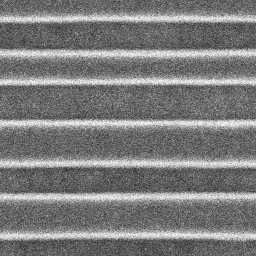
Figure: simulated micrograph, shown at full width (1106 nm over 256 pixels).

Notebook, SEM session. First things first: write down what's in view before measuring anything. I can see one or a few lines or trenches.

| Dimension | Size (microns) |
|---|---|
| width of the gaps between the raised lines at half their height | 0.138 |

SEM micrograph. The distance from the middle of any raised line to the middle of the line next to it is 321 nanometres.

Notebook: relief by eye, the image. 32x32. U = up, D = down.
UUUUUUUUUUUUUUUUUUUUUUUUUUUUUUUU
UUUUUUUUUUUUUUUUUUUUUUUUUUUUUUUU
UUUUUUUDDDDDDDDDDDDDDDDDDDDUDDDU
DDDDDDDDDDDDDDDDDDDDDDDDDDDDDDDD
DDDDDDDDDDDDDDDDDDDDDDDDDDDDDDDD
DDDDDDDDDDDDDDDDDDDDDDDDDDDDDDDD
DUDDDDDDDDDDDDDDDDDDDDDDDDDDDDDD
UUUUUUUUUUUUUUUUUUUUUUUUUUUUUUUU
UUUUUUUUUUUUUUUUUUUUUUUUUUUUUUUU
UUUUUUUUUUUUUUUUUUUUUUUUUUUUUUUU
DDDDDDDDDDDDDDDDDDDDDDDDDDDDDDDD
DDDDDDDDDDDDDDDDDDDDDDDDDDDDDDDD
DDDDDDDDDDDDDDDDDDDDDDDDDDDDDDDD
DDDDDDDDDDDDDDDDDDDDDDDDDDDDDDDD
DDDDDDDDDDDDDDDDDDDDDDDDDDDDDDDD
UUUUUUUUUUUUUUUUUUUUUUUUUUUUUUUU
UUUUUUUUUUUUUUUUUUUUUUUUUUUUUUUU
UUUUUUUUUUUUUUUUUUUUUUUUUUUUUUUU
UUUUUUUUUUUUUUUUUUUUUUUUUUUUUUUU
UUUUUUUUUUUUUUUUUUUUUUUUUUUUUUUU
UUUUUUUUUUUUUUUUUUUUUUUUUUUUUUUU
DDDDDDDDDDDDDDDDDDDDDDDDDDDDDDDD
DDDDDDDDDDDDDDDDDDDDDDDDDDDDDDDD
DDDDDDDDDDDDDDDDDDDDDDDDDDDDDDDD
DDDDDDDUUUUUUUUUUUUUUUUUUUUUUUUU
UUUUUUUUUUUUUUUUUUUUUUUUUUUUUUUU
UUUUUUUUUUUUUUUUUUUUUUUUUUUUUUUU
UUUUUUUUUUUUUUUUUUUUUUUUUUUUUUUU
UUUUUUUUUUUUUUUUUUUUUUUUUUUUUUUU
UUUUUUUUUUUUUUUUUUUUUUUUUUUUUUUU
DDDDDDDDDDDDDDDDDDDDDDDDDDDDDDDD
DDDDDDDDDDDDDDDDDDDDDDDDDDDDDDDD